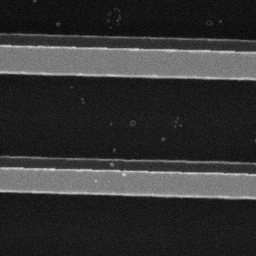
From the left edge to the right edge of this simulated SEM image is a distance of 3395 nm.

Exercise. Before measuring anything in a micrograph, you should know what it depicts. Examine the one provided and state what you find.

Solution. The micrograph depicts lines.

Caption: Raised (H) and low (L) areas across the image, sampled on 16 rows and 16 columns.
LLLLLLLLLLLLLLLL
LLLLLLLLLLLLLLLL
HHHHHHHHHHHHHHLL
HHHHHHHHHHHHHHHH
HHHHHHHHHHHHHHHH
LLLLLLLLLLLLLLLL
LLLLLLLLLLLLLLLL
LLLLLLLLLLLLLLLL
LLLLLLLLLLLLLLLL
LLLLLLLLLLLLLLLL
HHHHHHHHHHHHHHHH
HHHHHHHHHHHHHHHH
LLLLLLLLLLLLLLLL
LLLLLLLLLLLLLLLL
LLLLLLLLLLLLLLLL
LLLLLLLLLLLLLLLL